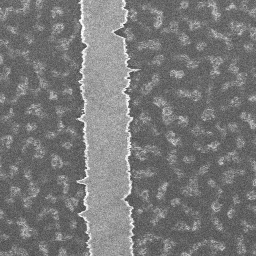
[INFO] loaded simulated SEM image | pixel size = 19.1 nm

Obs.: one or a few lines or trenches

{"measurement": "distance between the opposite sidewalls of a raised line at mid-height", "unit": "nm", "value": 820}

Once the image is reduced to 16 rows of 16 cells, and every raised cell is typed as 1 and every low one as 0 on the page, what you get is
0000011100000000
0000011100000000
0000011100000000
0000011100000000
0000011100000000
0000011100000000
0000011100000000
0000011100000000
0000011100000000
0000011100000000
0000011100000000
0000011100000000
0000011100000000
0000011100000000
0000001100000000
0000001100000000